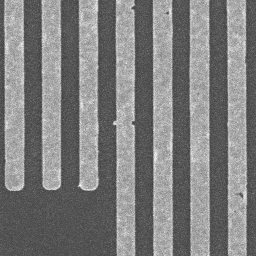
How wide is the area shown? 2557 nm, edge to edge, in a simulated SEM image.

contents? parallel lines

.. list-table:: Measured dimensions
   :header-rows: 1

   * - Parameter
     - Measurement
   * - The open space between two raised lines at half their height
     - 189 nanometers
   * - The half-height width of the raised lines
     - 181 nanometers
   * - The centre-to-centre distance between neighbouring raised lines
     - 37.1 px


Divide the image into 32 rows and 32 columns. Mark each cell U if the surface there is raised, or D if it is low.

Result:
DUUDDUUDDDUUDDDUUDDUUDDDUUDDUUUD
DUUDDUUDDDUUDDDUUDDUUDDDUUDDDUUD
DUUDDUUDDDUUDDDUUDDUUDDDUUDDDUUD
DUUDDUUDDDUUDDDUUDDUUDDDUUDDDUUD
DUUDDUUDDDUUDDDUUDDUUDDDUUDDDUUD
DUUDDUUUDDUUDDDUUDDUUDDDUUDDDUUD
DUUDDUUUDDUUDDDUUDDUUDDDUUDDDUUD
DUUDDUUUDDUUDDDUUDDUUDDDUUDDDUUD
DUUDDUUUDDUUDDDUUDDUUDDDUUDDDUUD
DUUDDUUUDDUUDDDUUDDUUDDDUUDDDUUD
DUUDDUUUDDUUDDDUUDDUUDDDUUDDDUUD
DUUDDUUUDDUUDDDUUDDUUDDDUUDDDUUD
DUUDDUUUDDUUDDDUUDDUUDDDUUDDDUUD
DUUDDUUUDDUUDDDUUDDUUDDDUUDDDUUD
DUUDDUUUDDUUDDDUUDDUUDDDUUDDDUUD
DUUDDUUUDDUUDDUUUDDUUDDDUUDDDUUD
DUUDDUUUDDUUDDDUUDDUUDDDUUDDDUUD
DUUDDUUUDDUUDDDUUDDUUDDDUUDDDUUD
DUUDDUUUDDUUDDDUUDDUUDDDUUDDDUUD
DUUDDUUUDDUUDDDUUDDUUDDDUUDDDUUD
DUUDDUUUDDUUDDDUUDDUUDDDUUDDDUUD
DUUDDUUUDDUUDDDUUDDUUDDDUUDDDUUD
DUUDDUUUDDUUDDDUUDDUUDDDUUDDDUUD
DUUDDDUDDDUUDDDUUDDUUDDDUUDDDUUD
DDDDDDDDDDDDDDDUUDDUUDDDUUDDDDDD
DDDDDDDDDDDDDDDUUDDUUDDDUUDDDUUD
DDDDDDDDDDDDDDDUUDDUUDDDUUDDDDUD
DDDDDDDDDDDDDDDUUDDUUUDDUUDDDUUD
DDDDDDDDDDDDDDDUUDDUUUDDUUDDDUUD
DDDDDDDDDDDDDDDUUDDUUUDDUUDDDUUD
DDDDDDDDDDDDDDDUUDDUUUDDUUDDDUUD
DDDDDDDDDDDDDDDUUDDUUUDDUUDDDUUD